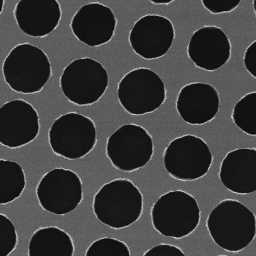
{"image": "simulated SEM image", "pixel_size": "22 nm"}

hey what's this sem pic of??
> a regular array of holes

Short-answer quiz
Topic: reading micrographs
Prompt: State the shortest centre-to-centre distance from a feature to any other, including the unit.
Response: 1.24 µm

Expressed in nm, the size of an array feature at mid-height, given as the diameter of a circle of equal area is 991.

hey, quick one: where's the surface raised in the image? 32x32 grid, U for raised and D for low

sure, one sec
UUDDDDDUUUUDUUUUUUUUUUUUUUDDDDUU
UUDDDDDUUUDDDDUUUUUUUUUUUUUDUUUU
UUDDDDDUUDDDDDUUUDDDDUUUUUUUUUUU
UUUDDDDUUDDDDDUUUDDDDDUUUUDUUUUU
UUUUDUUUUUDDDDUUDDDDDDUUDDDDUUUU
UUUUUUUUUUUDDUUUDDDDDUUUDDDDDUUU
UDDDDUUUUUUUUUUUUDDDDUUUDDDDDUUD
UDDDDDUUUUDDUUUUUUUUUUUUDDDDUUUD
DDDDDDUUDDDDDUUUUUUUUUUUUDDUUUUD
UDDDDDUUDDDDDUUUDDDDUUUUUUUUUUUU
UDDDDDUUDDDDDUUDDDDDUUUUDDUUUUUU
UUUDUUUUDDDDDUUDDDDDDUUDDDDUUUUU
UUUUUUUUUDDDUUUDDDDDUUDDDDDUUUDD
DDDDUUUUUUUUUUUUDDDDUUDDDDDUUDDD
DDDDDUUUDDUUUUUUUUUUUUUDDDDUUDDD
DDDDDUUDDDDDUUUUUUUUUUUUUUUUUUDD
DDDDDUDDDDDDUUDDDDUUUUUUUUUUUUUD
DDDDUUDDDDDDUUDDDDDUUUDDDUUUUUUU
UUUUUUUDDDDUUDDDDDDUUDDDDDUUUUUU
UUUUUUUUDDUUUUDDDDDUUDDDDDUUDDDD
DDUUUUUUUUUUUUDDDDUUUDDDDDUUDDDD
DDDUUUDDDUUUUUUUUUUUUDDDDDUUDDDD
DDDUUDDDDDUUUUUUUUUUUUUUUUUUDDDD
DDDUUDDDDDUUUDDDDUUUUUUUUUUUDDDD
DDUUUDDDDDUUDDDDDDUUDDDDUUUUUUUU
UUUUUDDDDDUUDDDDDDUDDDDDDUUDDDUU
UUUUUUDDDUUUDDDDDUUDDDDDDUDDDDDU
DUUUUUUUUUUUDDDDDUUDDDDDDUDDDDDD
DDUUUUUUUUUUUUUUUUUUDDDDUUDDDDDD
DDUUDDDDUUUUUUUUUUUUUDDUUUDDDDDD
DDUUDDDDDUUUDDDUUUUUUUUUUUUDDDDU
DUUUDDDDDUUDDDDDUUUDDDDUUUUUUUUU